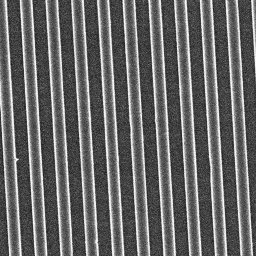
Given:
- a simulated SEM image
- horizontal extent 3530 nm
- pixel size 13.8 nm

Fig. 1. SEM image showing parallel lines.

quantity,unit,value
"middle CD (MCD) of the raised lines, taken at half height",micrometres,0.151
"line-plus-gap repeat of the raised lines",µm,0.354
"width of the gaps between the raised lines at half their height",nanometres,200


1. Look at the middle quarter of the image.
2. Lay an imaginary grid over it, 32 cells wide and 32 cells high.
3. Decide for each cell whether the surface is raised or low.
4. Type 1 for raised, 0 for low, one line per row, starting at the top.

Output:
00011100001100001100001110000110
00011100001100001100001110000110
00011100001100001110001110000110
00011100001100001110001110000111
00011100001100001110001110000111
00011100001100001110000110000111
00011100001100001110000110000111
00011100001100001110000110000111
00011100001110001110000110000111
00011100001110001110000111000111
00001100001110001110000111000111
00001100001110000110000111000111
00001100001110000110000111000011
00001100001110000110000111000011
00001110001110000110000111000011
00001110001110000110000111000011
00001110001110000110000111000011
00001110000110000111000111000011
00001110000110000111000111000011
00001110000110000111000111000011
00001110000110000111000111000011
10001110000110000111000111000011
10001110000110000111000011000011
10001110000110000111000011000011
10001110000110000111000011000011
10001110000111000111000011000011
10001110000111000111000011100011
10000110000111000111000011100011
10000110000111000011000011100011
10000110000111000011000011100011
10000110000111000011000011100011
10000111000111000011000011100011